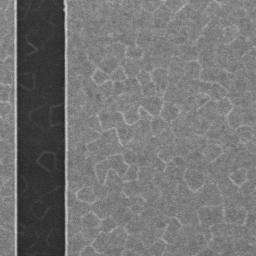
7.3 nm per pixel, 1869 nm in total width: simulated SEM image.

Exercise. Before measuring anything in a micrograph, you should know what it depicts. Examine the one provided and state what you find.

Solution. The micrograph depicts one or a few lines or trenches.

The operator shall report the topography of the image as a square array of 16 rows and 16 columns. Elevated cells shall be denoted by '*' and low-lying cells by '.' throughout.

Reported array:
*...************
*...************
*...************
*...************
*...************
*...************
*...************
*...************
*...************
*...************
*...************
*...************
*...************
*...************
*...************
*...************